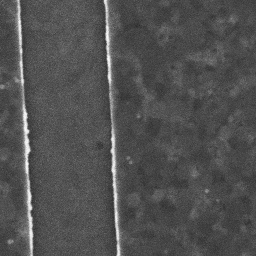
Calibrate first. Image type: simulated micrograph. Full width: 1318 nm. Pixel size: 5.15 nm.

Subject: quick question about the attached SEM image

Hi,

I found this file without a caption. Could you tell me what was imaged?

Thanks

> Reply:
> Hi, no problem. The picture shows one or a few lines or trenches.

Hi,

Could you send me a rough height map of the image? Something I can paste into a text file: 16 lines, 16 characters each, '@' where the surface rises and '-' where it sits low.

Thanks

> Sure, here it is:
@------@@@@@@@@@
@------@@@@@@@@@
@------@@@@@@@@@
@------@@@@@@@@@
@------@@@@@@@@@
@------@@@@@@@@@
@@-----@@@@@@@@@
@@-----@@@@@@@@@
@@-----@@@@@@@@@
@@-----@@@@@@@@@
@@-----@@@@@@@@@
@@-----@@@@@@@@@
@@-----@@@@@@@@@
@@-----@@@@@@@@@
@@-----@@@@@@@@@
@@-----@@@@@@@@@